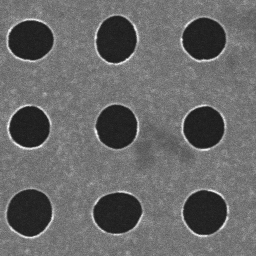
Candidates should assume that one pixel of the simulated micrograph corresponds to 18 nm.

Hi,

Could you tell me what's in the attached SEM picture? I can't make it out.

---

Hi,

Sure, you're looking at a regular array of holes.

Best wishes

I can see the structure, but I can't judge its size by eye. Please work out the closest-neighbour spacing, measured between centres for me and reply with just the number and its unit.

1540 nm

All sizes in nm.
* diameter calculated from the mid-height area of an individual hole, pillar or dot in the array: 780